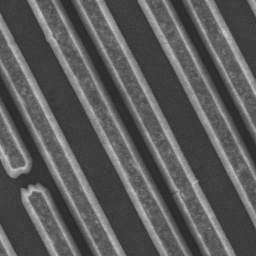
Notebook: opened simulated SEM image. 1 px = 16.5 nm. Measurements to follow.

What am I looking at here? parallel lines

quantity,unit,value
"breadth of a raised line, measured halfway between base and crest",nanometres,385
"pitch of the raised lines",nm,792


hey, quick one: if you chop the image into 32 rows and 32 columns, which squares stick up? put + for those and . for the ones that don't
....+++...+++.....+++..++++.....
.....+++..+++.....++++..+++.....
.....+++...+++.....+++..++++....
+.....+++..+++.....++++..+++....
+.....+++...+++.....+++..++++...
++.....+++..+++.....++++..+++...
++.....+++...+++.....+++..++++..
+++.....+++..+++......+++..+++..
+++.....+++...+++.....+++..++++.
.+++.....+++..++++.....+++..+++.
.+++.....+++...+++.....+++..++++
..+++.....+++..++++.....+++..+++
..+++.....+++...+++.....+++...++
...+++.....+++..++++.....+++..++
+..+++.....++++..+++.....+++...+
+...+++.....+++..++++.....+++..+
++..+++.....++++..+++.....+++...
++...+++.....+++..++++.....+++..
+++..+++......+++..+++.....+++..
+++...+++.....+++..++++.....+++.
.+++..+++......+++..+++.....+++.
.+.....+++.....+++...+++.....+++
.......+++......+++..+++.....+++
....+...+++.....+++..++++.....++
...+++..+++......+++..+++.....++
...+++...+++.....+++..++++.....+
....+++..+++......+++..+++.....+
....+++...+++.....+++...+++.....
.....+++..+++......+++..+++.....
.....++++..+++.....+++..++++....
+.....+++..++++.....+++..+++....
+.....++++..+++.....+++...+++...